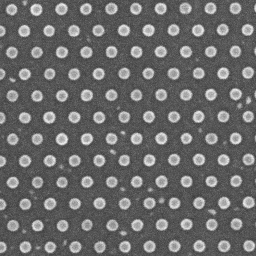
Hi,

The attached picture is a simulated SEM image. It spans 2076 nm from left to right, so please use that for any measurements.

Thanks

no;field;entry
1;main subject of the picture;a regular array of raised bodies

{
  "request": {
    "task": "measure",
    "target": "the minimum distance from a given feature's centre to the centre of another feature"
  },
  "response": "24.6 pixels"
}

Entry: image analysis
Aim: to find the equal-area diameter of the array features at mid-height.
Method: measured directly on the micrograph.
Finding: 83.3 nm